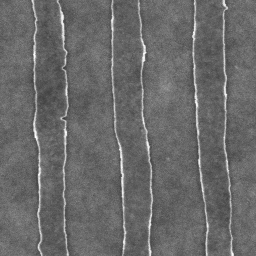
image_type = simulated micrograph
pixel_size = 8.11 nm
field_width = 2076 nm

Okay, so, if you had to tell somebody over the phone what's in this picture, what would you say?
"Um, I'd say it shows one or a few lines or trenches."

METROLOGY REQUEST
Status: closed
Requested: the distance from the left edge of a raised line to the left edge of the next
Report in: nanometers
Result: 656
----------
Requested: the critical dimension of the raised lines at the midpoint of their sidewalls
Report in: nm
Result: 234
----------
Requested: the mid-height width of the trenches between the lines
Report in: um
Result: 0.42